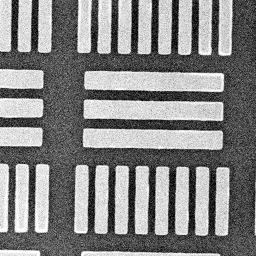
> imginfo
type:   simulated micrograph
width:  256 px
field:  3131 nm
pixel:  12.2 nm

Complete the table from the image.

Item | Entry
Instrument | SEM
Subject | groups of lines, slits or small figures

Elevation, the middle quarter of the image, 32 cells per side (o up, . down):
................................
................................
.....ooooooooooooooooooooooooooo
.....ooooooooooooooooooooooooooo
.....ooooooooooooooooooooooooooo
.....ooooooooooooooooooooooooooo
...................ooooooooooooo
................................
................................
.....oooooooooooooooooooooooo...
.....ooooooooooooooooooooooooooo
.....ooooooooooooooooooooooooooo
.....ooooooooooooooooooooooooooo
.............ooooooooooooooooooo
................................
................................
.....oooooooooooooooooooo.......
.....ooooooooooooooooooooooooooo
.....ooooooooooooooooooooooooooo
.....ooooooooooooooooooooooooooo
.....ooooooooooooooooooooooooooo
................................
................................
................................
................................
...ooo...oo.....................
...ooo..ooo..ooo..ooo..ooo..ooo.
...ooo..ooo..ooo..ooo..ooo..ooo.
...ooo..ooo..ooo..ooo..ooo..ooo.
...ooo..ooo..ooo..ooo..ooo..ooo.
...ooo..ooo..ooo..ooo..ooo..ooo.
...ooo..ooo..ooo..ooo..ooo..ooo.